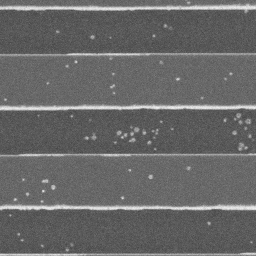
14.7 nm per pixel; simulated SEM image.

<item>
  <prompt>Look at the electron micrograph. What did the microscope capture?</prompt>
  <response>lines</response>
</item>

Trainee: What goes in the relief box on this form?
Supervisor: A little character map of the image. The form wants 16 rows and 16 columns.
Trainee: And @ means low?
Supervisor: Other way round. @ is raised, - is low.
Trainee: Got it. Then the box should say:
@@@@@@@@@@@@@@--
----------------
----------------
@@@@@@@@@@@@@@@@
@@@@@@@@@@@@@@@@
@@@@@@@@@@@@@@@@
@@@@@@@@@@@@@@@@
----------------
----------------
----------------
@@@@@@@@@@@@@@@@
@@@@@@@@@@@@@@@@
@@@@@@@@@@@@@@@@
----------------
----------------
----------------